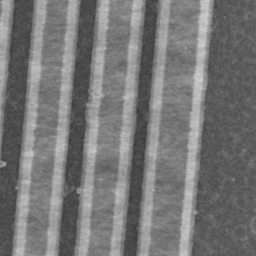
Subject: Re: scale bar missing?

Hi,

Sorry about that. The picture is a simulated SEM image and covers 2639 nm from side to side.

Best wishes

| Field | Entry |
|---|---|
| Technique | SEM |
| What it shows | one or a few lines or trenches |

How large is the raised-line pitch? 660 nanometers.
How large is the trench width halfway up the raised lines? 0.317 µm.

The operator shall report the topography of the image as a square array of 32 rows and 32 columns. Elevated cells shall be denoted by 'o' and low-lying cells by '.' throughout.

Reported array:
o....oooo....oooo....ooooo......
o....oooo....oooo....ooooo......
o....oooo....oooo....oooo.......
o....oooo....oooo...ooooo.......
.....oooo....oooo...ooooo.......
.....oooo....oooo...ooooo.......
.....oooo...ooooo...ooooo.......
.....ooo....ooooo...ooooo.......
....oooo....ooooo...ooooo.......
....oooo....oooo....ooooo.......
....oooo....oooo....ooooo.......
....oooo....oooo....ooooo.......
....oooo....oooo....ooooo.......
....oooo....oooo....ooooo.......
....oooo....oooo...ooooo........
....oooo....oooo...ooooo........
....oooo....oooo...ooooo........
....oooo....oooo...ooooo........
....oooo....oooo...ooooo........
...oooo....ooooo...ooooo........
...oooo....oooo....ooooo........
...oooo....oooo....ooooo........
...oooo....oooo....ooooo........
...oooo....oooo....ooooo........
...oooo....oooo....ooooo........
...oooo....oooo...ooooo.........
...oooo....oooo...ooooo.........
...oooo....oooo...ooooo.........
...oooo....oooo...ooooo.........
...oooo....oooo...ooooo.........
...ooo....ooooo...ooooo.........
..oooo....oooo....ooooo.........